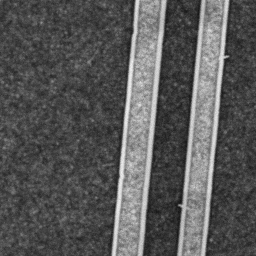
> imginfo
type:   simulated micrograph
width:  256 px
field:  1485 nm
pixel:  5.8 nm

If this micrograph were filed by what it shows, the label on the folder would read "one or a few lines or trenches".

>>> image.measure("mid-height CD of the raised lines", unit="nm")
142